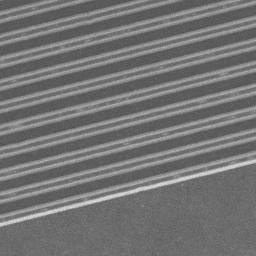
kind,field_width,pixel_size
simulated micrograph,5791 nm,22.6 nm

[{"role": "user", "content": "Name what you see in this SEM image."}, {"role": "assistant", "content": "parallel lines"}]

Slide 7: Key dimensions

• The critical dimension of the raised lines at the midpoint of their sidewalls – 0.178 um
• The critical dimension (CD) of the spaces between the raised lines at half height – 310 nanometres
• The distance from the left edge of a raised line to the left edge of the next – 0.496 microns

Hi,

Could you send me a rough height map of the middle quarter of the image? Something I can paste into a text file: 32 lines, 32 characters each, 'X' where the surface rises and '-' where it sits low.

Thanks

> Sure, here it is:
XXXXXXX---------------XXXXXXX---
XXX---------------XXXXXXXX------
--------------XXXXXXX-----------
----------XXXXXXX---------------
-----XXXXXXXX----------------XXX
-XXXXXXXX----------------XXXXXXX
XXXXX----------------XXXXXXX----
X----------------XXXXXXX--------
-------------XXXXXXX------------
---------XXXXXXX---------------X
-----XXXXXXX---------------XXXXX
XXXXXXXX---------------XXXXXXXX-
XXXX---------------XXXXXXXX-----
---------------XXXXXXXX---------
-----------XXXXXXXX-------------
-------XXXXXXXX---------------XX
---XXXXXXXXX--------------XXXXXX
XXXXXXX--------------XXXXXXXXX--
XXX--------------XXXXXXXXX------
-------------XXXXXXXXX----------
---------XXXXXXXXX--------------
-----XXXXXXXXX--------------XXXX
-XXXXXXXXX--------------XXXXXXXX
XXXXXX--------------XXXXXXXX----
XX--------------XXXXXXXX--------
------------XXXXXXXX------------
--------XXXXXXXX--------------XX
----XXXXXXXX--------------XXXXXX
XXXXXXXX--------------XXXXXXXX--
XXXX--------------XXXXXXXXX-----
--------------XXXXXXXXX---------
----------XXXXXXXX--------------